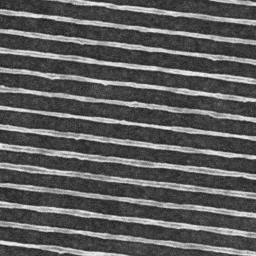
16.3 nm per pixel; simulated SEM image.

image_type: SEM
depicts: parallel lines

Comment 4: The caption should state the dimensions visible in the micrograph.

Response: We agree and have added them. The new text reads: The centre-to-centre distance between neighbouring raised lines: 310 nanometres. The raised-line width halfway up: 70.6 nanometers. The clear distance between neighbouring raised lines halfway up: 14.8 pixels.